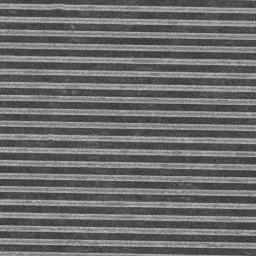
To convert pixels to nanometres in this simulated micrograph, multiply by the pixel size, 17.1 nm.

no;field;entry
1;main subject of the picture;parallel lines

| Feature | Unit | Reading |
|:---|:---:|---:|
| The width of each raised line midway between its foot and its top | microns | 0.0726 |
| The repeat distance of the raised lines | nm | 223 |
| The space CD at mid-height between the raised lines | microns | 0.147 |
